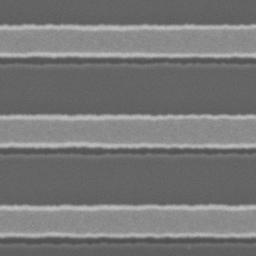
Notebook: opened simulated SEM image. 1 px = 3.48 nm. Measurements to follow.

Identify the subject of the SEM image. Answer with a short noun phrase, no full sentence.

lines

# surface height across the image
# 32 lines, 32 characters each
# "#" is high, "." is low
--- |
................................
................................
................................
################################
################################
################################
################################
................................
................................
................................
................................
................................
................................
................................
...............................#
################################
################################
################################
................................
................................
................................
................................
................................
................................
................................
................................
################################
################################
################################
#..##...################..######
................................
................................